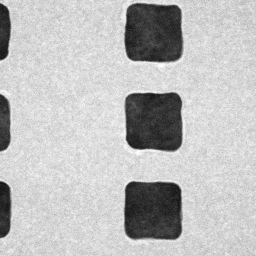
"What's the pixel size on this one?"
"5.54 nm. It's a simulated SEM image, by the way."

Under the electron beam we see holes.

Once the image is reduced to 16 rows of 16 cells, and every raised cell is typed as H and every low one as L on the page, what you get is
HHHHHHHHLLLHHHHH
LHHHHHHHLLLHHHHH
LHHHHHHHLLLHHHHH
HHHHHHHHLLLHHHHH
HHHHHHHHHHHHHHHH
HHHHHHHHHHHHHHHH
LHHHHHHHLLLHHHHH
LHHHHHHHLLLHHHHH
LHHHHHHHLLLHHHHH
HHHHHHHHHHHHHHHH
HHHHHHHHHHHHHHHH
HHHHHHHHLLLHHHHH
LHHHHHHHLLLHHHHH
LHHHHHHHLLLHHHHH
HHHHHHHHLLLHHHHH
HHHHHHHHHHHHHHHH